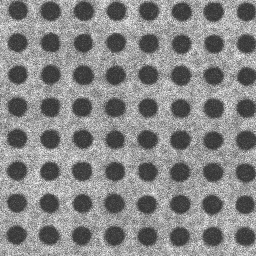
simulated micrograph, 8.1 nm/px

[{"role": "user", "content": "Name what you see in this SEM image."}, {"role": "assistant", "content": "a regular array of holes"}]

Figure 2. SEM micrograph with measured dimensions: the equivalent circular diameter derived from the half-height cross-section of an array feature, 156 nm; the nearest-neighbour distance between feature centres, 258 nm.